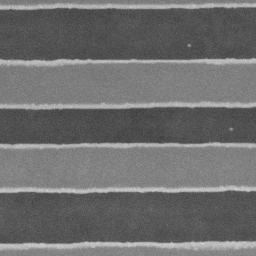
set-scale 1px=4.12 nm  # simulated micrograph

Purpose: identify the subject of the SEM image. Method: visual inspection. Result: lines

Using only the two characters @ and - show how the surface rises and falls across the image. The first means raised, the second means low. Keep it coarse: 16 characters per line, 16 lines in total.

@@@--@--@-------
----------------
----------------
----------------
@@@@@@@@@@@@@@@@
@@@@@@@@@@@@@@@@
@@@@@@@@@@@@@@@@
----------------
----------------
@@@@@@@@@@@@@@@@
@@@@@@@@@@@@@@@@
@@@@@@@@@@@@@@@@
----------------
----------------
----------------
@@@@@@@@@@@@@@@@